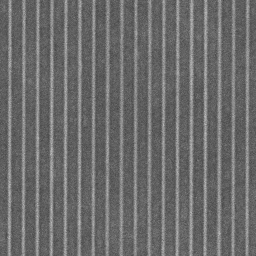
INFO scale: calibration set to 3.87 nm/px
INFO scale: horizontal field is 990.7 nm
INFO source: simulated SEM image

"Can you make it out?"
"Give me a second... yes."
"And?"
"parallel lines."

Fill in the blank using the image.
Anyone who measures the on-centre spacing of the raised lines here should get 0.0541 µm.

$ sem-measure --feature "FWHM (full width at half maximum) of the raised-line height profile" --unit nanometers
10.2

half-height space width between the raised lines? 44 nanometers